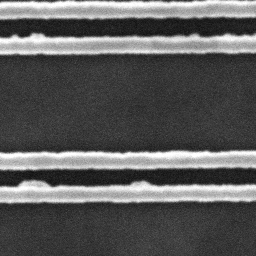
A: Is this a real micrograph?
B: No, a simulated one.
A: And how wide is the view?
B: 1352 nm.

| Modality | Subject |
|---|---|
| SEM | lines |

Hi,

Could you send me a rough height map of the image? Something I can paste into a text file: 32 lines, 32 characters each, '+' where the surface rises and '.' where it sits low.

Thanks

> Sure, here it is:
++++++++++++++++++++++++++++++++
++++++++++++++++++++++++++++++++
................................
................................
................................
++++++++++++++++++++++++++++++++
++++++++++++++++++++++++++..++.+
................................
................................
................................
................................
................................
................................
................................
................................
................................
................................
................................
................................
++++++++++++++++++++++++++++++++
++++++++++++++++++++++++++++++++
................................
................................
++++++++++++++++++++++++++++++++
++++++++++++++++++++++++++++++++
................................
................................
................................
................................
................................
................................
................................